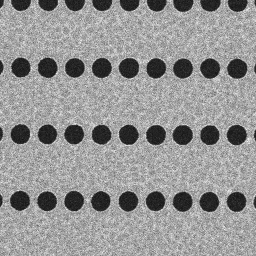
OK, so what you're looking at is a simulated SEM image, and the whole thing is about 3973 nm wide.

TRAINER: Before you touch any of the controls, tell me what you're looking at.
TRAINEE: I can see a regular array of holes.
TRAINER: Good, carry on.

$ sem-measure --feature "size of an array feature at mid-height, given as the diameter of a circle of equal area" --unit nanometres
315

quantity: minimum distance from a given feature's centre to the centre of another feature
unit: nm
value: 419